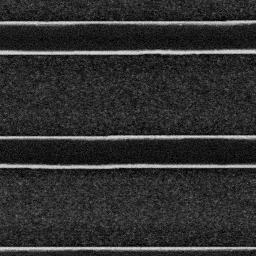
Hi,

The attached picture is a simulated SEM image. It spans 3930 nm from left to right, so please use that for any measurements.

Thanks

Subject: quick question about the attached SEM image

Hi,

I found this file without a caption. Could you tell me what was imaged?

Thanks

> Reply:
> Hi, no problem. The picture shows lines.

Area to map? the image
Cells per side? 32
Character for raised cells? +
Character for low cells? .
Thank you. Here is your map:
................................
................................
................................
++++++++++++++++++++++++++++++++
++++++++++++++++++++++++++++++++
++++++++++++++++++++++++++++++++
++++++++++++++++++++++++++++++++
................................
................................
................................
................................
................................
................................
................................
................................
................................
................................
++++++++++++++++++++++++++++++++
++++++++++++++++++++++++++++++++
++++++++++++++++++++++++++++++++
++++++++++++++++++++++++++++++++
................................
................................
................................
................................
................................
................................
................................
................................
................................
................................
++++++++++++++++++++++++++++++++